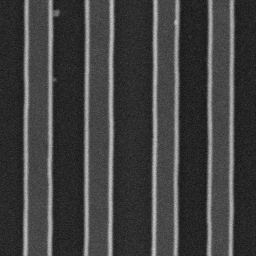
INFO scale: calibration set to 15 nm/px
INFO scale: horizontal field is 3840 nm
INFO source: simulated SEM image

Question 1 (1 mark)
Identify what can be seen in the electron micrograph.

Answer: groups of lines, slits or small figures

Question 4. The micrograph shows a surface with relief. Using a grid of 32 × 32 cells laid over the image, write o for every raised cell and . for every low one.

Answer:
...ooo.....ooo.....ooo....ooo...
...ooo.....ooo.....ooo....ooo...
...ooo.....ooo.....ooo....ooo...
...ooo.....ooo.....ooo....ooo...
...ooo.....ooo.....ooo....ooo...
...ooo.....ooo.....ooo....ooo...
...ooo.....ooo.....ooo....ooo...
...ooo.....ooo.....ooo....ooo...
...ooo.....ooo.....ooo....ooo...
...ooo.....ooo.....ooo....ooo...
...ooo.....ooo.....ooo....ooo...
...ooo.....ooo.....ooo....ooo...
...ooo.....ooo.....ooo....ooo...
...ooo.....ooo.....ooo....ooo...
...ooo.....ooo.....ooo....ooo...
...ooo.....ooo.....ooo....ooo...
...ooo.....ooo.....ooo....ooo...
...ooo.....ooo.....ooo....ooo...
...ooo.....ooo.....ooo....ooo...
...ooo.....ooo.....ooo....ooo...
...ooo.....ooo.....ooo....ooo...
...ooo.....ooo.....ooo....ooo...
...ooo.....ooo.....ooo....ooo...
...ooo.....ooo.....ooo....ooo...
...ooo.....ooo.....ooo....ooo...
...ooo.....ooo.....ooo....ooo...
...ooo.....ooo.....ooo....ooo...
...ooo.....ooo.....ooo....ooo...
...ooo.....ooo.....ooo....ooo...
...ooo.....ooo.....ooo....ooo...
...ooo.....ooo.....ooo....ooo...
...ooo.....ooo.....ooo....ooo...